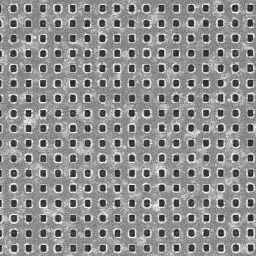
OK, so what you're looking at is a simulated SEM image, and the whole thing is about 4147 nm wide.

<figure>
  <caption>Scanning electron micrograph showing a regular array of holes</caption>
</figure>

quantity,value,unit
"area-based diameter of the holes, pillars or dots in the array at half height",0.118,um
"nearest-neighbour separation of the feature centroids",234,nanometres